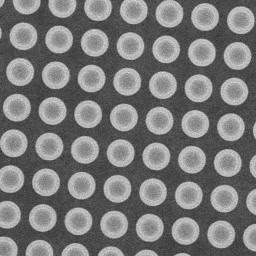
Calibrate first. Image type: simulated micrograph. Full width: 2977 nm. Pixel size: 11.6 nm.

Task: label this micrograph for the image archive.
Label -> an array of small figures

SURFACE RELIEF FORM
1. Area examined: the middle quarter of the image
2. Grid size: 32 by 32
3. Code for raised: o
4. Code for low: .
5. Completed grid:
......oo........................
o...oooooo....oooo..............
o...oooooo...oooooo....oooo.....
o...oooooo..ooooooo...oooooo...o
o...oooooo..ooooooo..ooooooo...o
....oooooo...oooooo..ooooooo..oo
.....oooo....oooooo...oooooo..oo
..............ooo.....ooooo...oo
........................oo.....o
....oooo........................
...oooooo....oooo...............
...oooooo...oooooo....oooo......
...oooooo...oooooo...oooooo....o
...oooooo...oooooo...oooooo...oo
...oooooo...oooooo...oooooo..ooo
....oooo....oooooo...oooooo..ooo
..............oo.....ooooo....oo
.......................oo.....oo
....ooo.........................
..oooooo....oooo................
..oooooo...oooooo....oooo.......
..ooooooo..oooooo...oooooo....oo
..oooooo...oooooo...oooooo...ooo
..oooooo...oooooo...oooooo...ooo
....ooo.....ooooo...oooooo...ooo
.............oo......ooooo...ooo
..............................oo
...ooo..........................
..ooooo....oooo.................
.ooooooo..oooooo....ooooo.....o.
.ooooooo..ooooooo..oooooo....ooo
.ooooooo..ooooooo..ooooooo..oooo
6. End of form